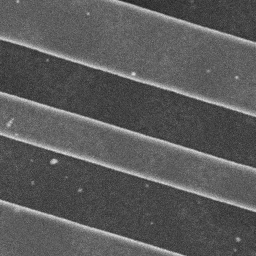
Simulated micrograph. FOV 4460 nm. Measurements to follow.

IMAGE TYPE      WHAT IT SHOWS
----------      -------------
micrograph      lines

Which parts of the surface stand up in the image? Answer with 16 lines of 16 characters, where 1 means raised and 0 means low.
1111111110000000
1111111111110000
1111111111111110
0000111111111111
0000000111111111
0000000000111111
1110000000000111
1111110000000000
1111111110000000
0000111111110000
0000000111111111
0000000000111111
0000000000000011
1110000000000000
1111111000000000
1111111111000000